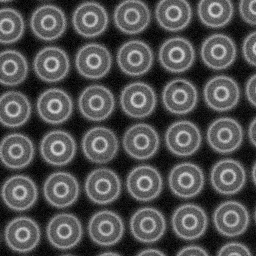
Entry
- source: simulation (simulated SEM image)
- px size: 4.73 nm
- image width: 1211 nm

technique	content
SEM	an array of small figures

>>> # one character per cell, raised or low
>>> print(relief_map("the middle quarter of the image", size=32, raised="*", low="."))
.***..***..***.......****......*
****.......****.....*******..***
*****.....**********************
********************************
****************************..**
*****************...******......
******....******.....*****......
*****......****...*...***..***..
.***...**...***..***..***..****.
.***..****..***..***..***...**..
..**...***..***...*...****......
.****.......****......*****....*
.****......******....***********
*******..***********************
********************************
*******************.********....
********..*******.....*****.....
******......****.......***...**.
.*****..*....**...***..***..****
..***..****..**...***..***...**.
..***..****..***..***..****.....
..***...**...***.......*****....
..****......*****.....********.*
.******....*********************
********************************
*****************************...
******************....******....
*******.....*****......****.....
..****.......****..**...***..***
...***..***..***...***..***..***
*..***..***...**...***..***..**.
*..***..***..****...*...****....